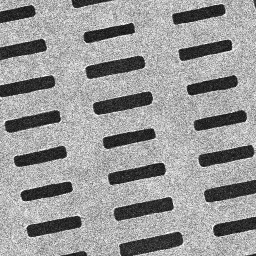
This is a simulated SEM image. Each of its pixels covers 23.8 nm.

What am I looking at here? a regular array of holes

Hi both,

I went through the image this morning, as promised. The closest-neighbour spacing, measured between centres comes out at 849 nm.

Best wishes